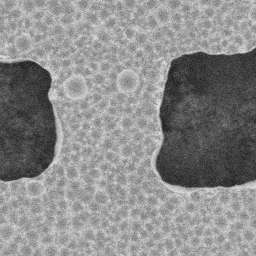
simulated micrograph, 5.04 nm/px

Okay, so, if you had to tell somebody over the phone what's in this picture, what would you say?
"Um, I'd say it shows holes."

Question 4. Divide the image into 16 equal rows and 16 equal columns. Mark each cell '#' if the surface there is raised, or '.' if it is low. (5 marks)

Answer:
################
################
################
###########.....
...########.....
...#######......
...#######......
....######......
....######......
...#######......
...#######......
##########......
################
################
################
################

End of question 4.